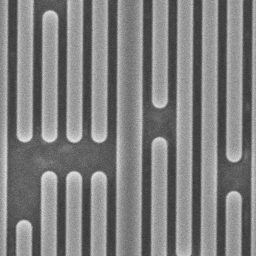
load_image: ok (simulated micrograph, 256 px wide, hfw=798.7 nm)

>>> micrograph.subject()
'groups of lines, slits or small figures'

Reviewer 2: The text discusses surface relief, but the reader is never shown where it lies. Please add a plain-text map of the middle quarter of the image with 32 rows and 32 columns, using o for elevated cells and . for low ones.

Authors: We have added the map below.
.ooo...oooo..oooooo...oooo..oooo
.ooo...oooo..oooooo...oooo..oooo
.ooo...oooo..oooooo...oooo..oooo
.ooo...oooo..oooooo...oooo..oooo
.ooo...oooo..oooooo...oooo..oooo
.ooo...oooo..oooooo...oooo..oooo
.ooo...oooo..oooooo...oooo..oooo
.ooo...oooo..oooooo...oooo..oooo
.ooo...oooo..oooooo...oooo..oooo
.ooo...oooo..oooooo...oooo..oooo
.ooo...oooo..oooooo....oo...oooo
.ooo...oooo..oooooo.........oooo
.ooo...oooo..oooooo.........oooo
.ooo...oooo..oooooo.........oooo
.ooo...oooo..oooooo.........oooo
.ooo...oooo..oooooo.........oooo
.ooo...oooo..oooooo.........oooo
.ooo...oooo..oooooo.........oooo
.ooo...oooo..oooooo.........oooo
.............oooooo...oooo..oooo
.............oooooo...oooo..oooo
.............oooooo...oooo..oooo
.............oooooo...oooo..oooo
.............oooooo...oooo..oooo
.............oooooo...oooo..oooo
.............oooooo...oooo..oooo
.............oooooo...oooo..oooo
.ooo....oo...oooooo...oooo..oooo
.ooo...oooo..oooooo...oooo..oooo
.ooo...oooo..oooooo...oooo..oooo
.ooo...oooo..oooooo...oooo..oooo
.ooo...oooo..oooooo...oooo..oooo